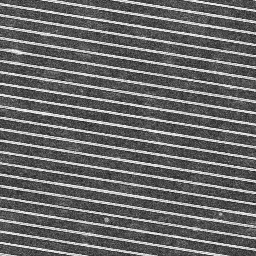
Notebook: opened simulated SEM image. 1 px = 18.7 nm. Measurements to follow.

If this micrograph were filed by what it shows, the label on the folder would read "parallel lines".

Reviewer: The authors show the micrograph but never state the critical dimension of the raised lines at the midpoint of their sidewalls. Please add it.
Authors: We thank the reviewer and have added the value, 37 nm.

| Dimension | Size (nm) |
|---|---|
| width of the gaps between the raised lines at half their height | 171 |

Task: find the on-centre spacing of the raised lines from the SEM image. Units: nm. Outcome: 210